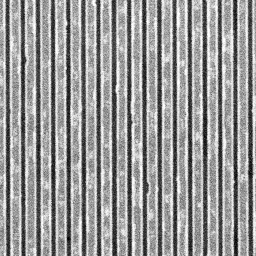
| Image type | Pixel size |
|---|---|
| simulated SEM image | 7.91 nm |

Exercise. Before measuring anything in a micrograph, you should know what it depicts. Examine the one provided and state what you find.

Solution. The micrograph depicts parallel lines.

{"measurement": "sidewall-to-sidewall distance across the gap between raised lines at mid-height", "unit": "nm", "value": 47.4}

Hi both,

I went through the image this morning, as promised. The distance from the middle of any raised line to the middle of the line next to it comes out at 120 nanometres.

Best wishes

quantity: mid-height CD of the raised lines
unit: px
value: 9.37